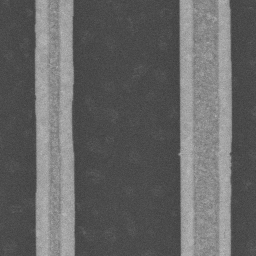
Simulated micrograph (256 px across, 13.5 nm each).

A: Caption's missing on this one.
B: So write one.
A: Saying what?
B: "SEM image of one or a few lines or trenches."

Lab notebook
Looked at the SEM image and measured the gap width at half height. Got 1640 nm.